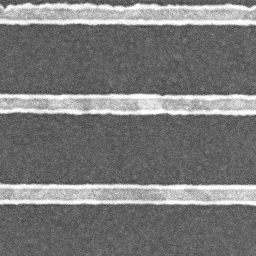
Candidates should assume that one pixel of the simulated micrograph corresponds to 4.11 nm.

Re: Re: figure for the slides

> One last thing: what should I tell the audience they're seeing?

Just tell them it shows one or a few lines or trenches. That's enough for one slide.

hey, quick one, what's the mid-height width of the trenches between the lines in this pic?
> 306 nm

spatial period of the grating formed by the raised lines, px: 90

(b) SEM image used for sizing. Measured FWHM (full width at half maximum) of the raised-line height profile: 0.0622 micrometres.